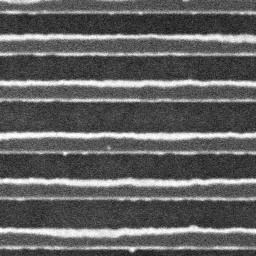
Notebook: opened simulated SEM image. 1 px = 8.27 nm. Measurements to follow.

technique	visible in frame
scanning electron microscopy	lines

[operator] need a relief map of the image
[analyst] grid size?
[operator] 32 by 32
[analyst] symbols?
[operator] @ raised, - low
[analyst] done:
@@@@@@@@@@@@@@@@@@@@@@@@@@@@@@@@
@@@@@@@@@@@@@@@@@@@@@@@@@@@@@@@@
--------------------------------
--------------------------------
-------@------@@-@@@------------
@@@@@@@@@@@@@@@@@@@@@@@@@@@@@@@@
@@@@@@@@@@@@@@@@@@@@@@@@@@@@@@@@
--------------------------------
--------------------------------
--------------------------------
@@@@@@@@@@@@@@@@@@@@@@@@@@@@@@@@
@@@@@@@@@@@@@@@@@@@@@@@@@@@@@@@@
--@@@@@@@@@@@@@@@@@@@@@@@@@@@@@@
--------------------------------
--------------------------------
--------------------------------
--------------------------------
@@@@@@@@@@@@@@@@@@@@@@@@@@@@@@@@
@@@@@@@@@@@@@@@@@@@@@@@@@@@@@@@@
--------------------------------
--------------------------------
--------------------------------
--------------------------------
@@@@@@@@@@@@@@@@@@@@@@@@@@@@@@@@
@@@@@@@@@@@@@@@@@@@@@@@@@@@@@@@@
--------------------------------
--------------------------------
--------------------------------
------------------------@-------
@@@@@@@@@@@@@@@@@@@@@@@@@@@@@@@@
@@@@@@@@@@@@@@@@@@@@@@@@@@@@@@@@
--------------------------------